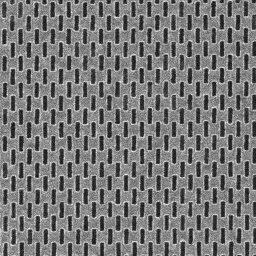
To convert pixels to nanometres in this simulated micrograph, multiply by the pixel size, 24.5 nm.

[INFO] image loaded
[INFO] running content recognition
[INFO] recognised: a regular array of holes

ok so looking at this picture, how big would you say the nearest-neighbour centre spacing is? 0.375 um